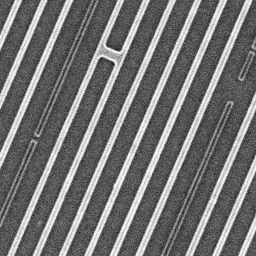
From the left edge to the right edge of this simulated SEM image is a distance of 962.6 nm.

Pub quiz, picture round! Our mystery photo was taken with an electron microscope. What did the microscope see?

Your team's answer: parallel lines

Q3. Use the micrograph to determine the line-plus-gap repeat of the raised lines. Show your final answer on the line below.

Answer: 88.5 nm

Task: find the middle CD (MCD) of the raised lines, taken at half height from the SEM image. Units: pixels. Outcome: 4.57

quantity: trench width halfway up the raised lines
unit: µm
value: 0.0721